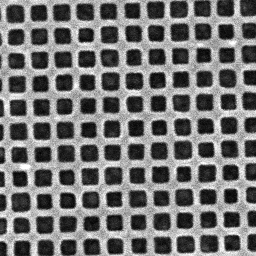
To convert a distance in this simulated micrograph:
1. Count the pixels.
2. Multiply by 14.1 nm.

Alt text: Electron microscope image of a regular array of holes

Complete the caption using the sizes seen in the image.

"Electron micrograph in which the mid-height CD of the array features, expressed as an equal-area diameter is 267 nm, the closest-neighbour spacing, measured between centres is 0.325 µm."